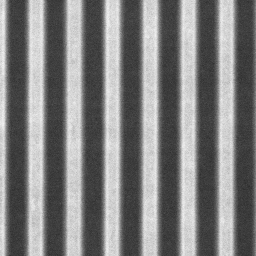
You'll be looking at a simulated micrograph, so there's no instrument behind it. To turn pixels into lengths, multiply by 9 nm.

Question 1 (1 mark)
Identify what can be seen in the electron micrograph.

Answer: parallel lines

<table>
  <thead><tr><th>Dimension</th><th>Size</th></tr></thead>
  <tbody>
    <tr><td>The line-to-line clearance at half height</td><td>0.19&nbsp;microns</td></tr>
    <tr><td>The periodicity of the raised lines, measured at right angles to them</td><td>342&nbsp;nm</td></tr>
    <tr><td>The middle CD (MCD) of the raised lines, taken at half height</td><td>156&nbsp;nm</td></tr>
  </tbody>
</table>